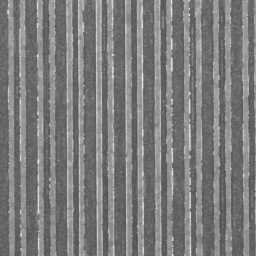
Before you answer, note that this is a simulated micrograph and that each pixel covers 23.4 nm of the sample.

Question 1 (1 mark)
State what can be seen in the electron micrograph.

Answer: parallel lines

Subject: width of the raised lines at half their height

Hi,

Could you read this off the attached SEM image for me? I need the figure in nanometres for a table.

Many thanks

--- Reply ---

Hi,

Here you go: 114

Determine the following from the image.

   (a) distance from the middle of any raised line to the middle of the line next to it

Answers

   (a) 0.343 microns